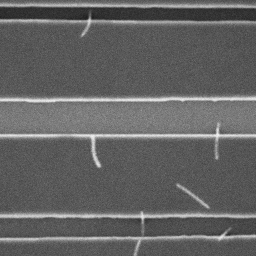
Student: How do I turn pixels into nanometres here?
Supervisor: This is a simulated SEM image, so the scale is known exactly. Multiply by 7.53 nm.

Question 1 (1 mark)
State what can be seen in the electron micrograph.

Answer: lines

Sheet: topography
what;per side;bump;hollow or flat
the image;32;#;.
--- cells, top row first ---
################################
................................
...........#....................
################################
################################
################################
################################
################################
################################
################################
################################
################################
#####################.....#.....
................................
................................
................................
................................
################################
################################
################################
################################
################################
################################
################################
################################
################################
################################
................................
................................
...........................#####
################################
################################